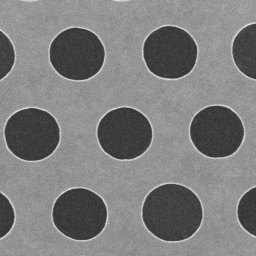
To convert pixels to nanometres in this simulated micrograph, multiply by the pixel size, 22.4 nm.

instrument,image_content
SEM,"holes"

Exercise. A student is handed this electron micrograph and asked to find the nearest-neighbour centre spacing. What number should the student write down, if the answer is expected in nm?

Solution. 2070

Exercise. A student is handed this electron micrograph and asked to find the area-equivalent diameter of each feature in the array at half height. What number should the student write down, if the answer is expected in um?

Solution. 1.21